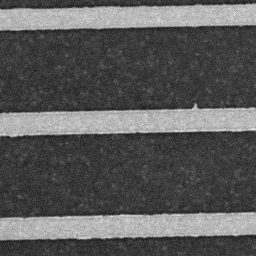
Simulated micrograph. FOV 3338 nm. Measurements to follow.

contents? one or a few lines or trenches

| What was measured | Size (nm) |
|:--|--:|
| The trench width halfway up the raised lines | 1090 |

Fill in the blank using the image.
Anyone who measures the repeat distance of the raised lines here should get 1360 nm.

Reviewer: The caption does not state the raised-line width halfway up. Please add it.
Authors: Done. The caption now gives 274 nanometers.